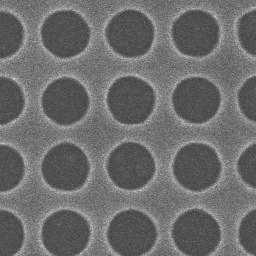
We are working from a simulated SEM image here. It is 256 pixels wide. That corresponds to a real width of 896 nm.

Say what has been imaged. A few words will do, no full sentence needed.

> a regular array of holes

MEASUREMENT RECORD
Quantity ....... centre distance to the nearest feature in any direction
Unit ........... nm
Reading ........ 229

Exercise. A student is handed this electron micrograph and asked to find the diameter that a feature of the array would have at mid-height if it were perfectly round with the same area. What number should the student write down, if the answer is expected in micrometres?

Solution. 0.169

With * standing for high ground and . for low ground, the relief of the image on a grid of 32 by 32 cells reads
********************************
.******..******...*****...*****.
..****.....***.....***.....***..
...**......**......***.....***..
...**......**......***.....***..
...**......***.....***.....***..
..****....****....*****...*****.
********************************
********************************
********************************
..****....****.....***.....***..
...**......**......***.....***..
...**......**......**.......**..
...**......***.....***.....***..
..****.....***.....***.....****.
.******..*******.***************
********************************
********************************
..*****...****....*****...*****.
...***.....***.....***.....***..
...**......**......***......**..
...**......**......***......**..
...***.....***.....***.....***..
..*****...*****..******...******
********************************
********************************
.******...*****...*****...*****.
..****.....***.....***.....***..
...**......**.......**.....***..
...**......**.......*.......**..
...**......***.....***.....***..
..****....****....*****....****.